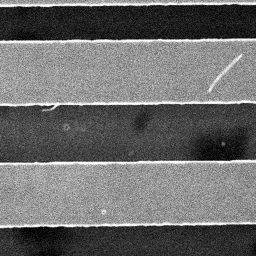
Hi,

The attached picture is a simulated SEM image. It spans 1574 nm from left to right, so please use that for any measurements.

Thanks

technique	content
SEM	lines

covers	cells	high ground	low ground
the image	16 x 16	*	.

................
................
.........*..****
****************
****************
****************
**********.*....
................
................
................
****************
****************
****************
****************
................
................